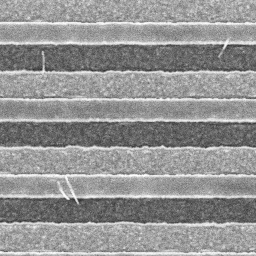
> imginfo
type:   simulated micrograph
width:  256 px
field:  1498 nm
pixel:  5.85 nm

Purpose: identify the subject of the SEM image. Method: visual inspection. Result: lines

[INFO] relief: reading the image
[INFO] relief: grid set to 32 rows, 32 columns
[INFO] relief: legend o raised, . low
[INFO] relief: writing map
oooooooooooooooooooooooooooooooo
oooooooooooooooooooooooooooooooo
oooooooooooooooooooooooooooooooo
oooooooooooooooooooooooooooooooo
oooooooooooooooooooooooooooooooo
..o........o.....oo.o.......o...
................................
................................
................................
oooooooooooooooooooooooooooooooo
oooooooooooooooooooooooooooooooo
oooooooooooooooooooooooooooooooo
oooooooooooooooooooooooooooooooo
oooooooooooooooooooooooooooooooo
oooooooooooooooooooooooooooooooo
................................
................................
................................
...o....oo.o..o...o.o..o...oo.o.
oooooooooooooooooooooooooooooooo
oooooooooooooooooooooooooooooooo
oooooooooooooooooooooooooooooooo
oooooooooooooooooooooooooooooooo
oooooooooooooooooooooooooooooooo
oooooooooooooooooooooooooooooooo
................................
................................
................................
oooooooooooooooooooooooooooooooo
oooooooooooooooooooooooooooooooo
oooooooooooooooooooooooooooooooo
oooooooooooooooooooooooooooooooo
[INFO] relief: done